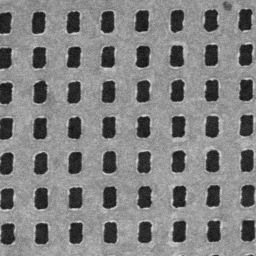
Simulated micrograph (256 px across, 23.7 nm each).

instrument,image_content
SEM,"a regular array of holes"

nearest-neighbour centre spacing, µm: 0.813